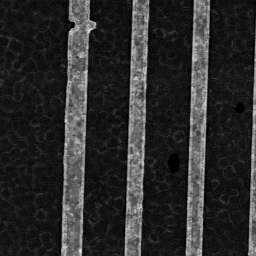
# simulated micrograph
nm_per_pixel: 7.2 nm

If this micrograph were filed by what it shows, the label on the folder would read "one or a few lines or trenches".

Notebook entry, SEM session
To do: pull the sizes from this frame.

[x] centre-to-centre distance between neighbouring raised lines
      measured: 440 nm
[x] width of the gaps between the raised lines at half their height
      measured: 338 nanometers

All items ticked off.